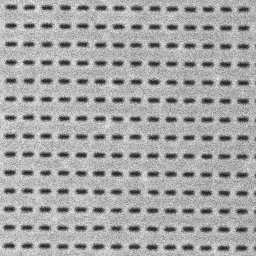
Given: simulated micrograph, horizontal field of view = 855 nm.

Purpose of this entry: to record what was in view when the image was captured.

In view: a regular array of holes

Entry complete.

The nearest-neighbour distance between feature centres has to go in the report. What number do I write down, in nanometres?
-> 58.9